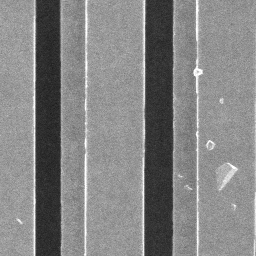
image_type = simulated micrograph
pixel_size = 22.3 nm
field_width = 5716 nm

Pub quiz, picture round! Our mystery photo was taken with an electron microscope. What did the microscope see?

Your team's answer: lines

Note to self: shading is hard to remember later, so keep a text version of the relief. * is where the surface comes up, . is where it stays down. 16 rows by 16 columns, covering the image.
**..*****..*****
**..*****..*****
**..*****..*****
**..*****..*****
**..*****..*****
**..*****..*****
**..*****..*****
**..*****..*****
**..*****..*****
**..*****..*****
**..*****..*****
**..*****..*****
**..*****..*****
**..*****..*****
**..*****..*****
**..*****..*****